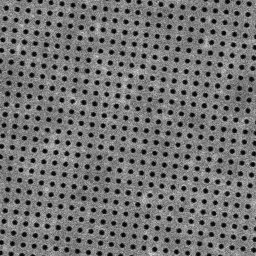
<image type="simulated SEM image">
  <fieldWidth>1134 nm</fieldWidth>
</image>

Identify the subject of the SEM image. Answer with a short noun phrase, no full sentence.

a regular array of holes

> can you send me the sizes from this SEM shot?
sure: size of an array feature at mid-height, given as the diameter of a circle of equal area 0.0218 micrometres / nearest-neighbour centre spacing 0.0462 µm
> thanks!